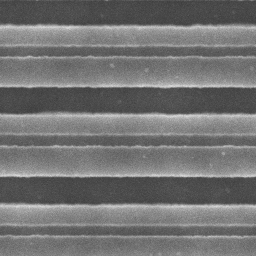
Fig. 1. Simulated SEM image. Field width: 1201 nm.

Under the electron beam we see lines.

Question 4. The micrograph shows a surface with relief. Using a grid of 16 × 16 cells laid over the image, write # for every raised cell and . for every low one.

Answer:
................
................
################
################
################
................
................
################
################
################
################
................
................
################
################
################